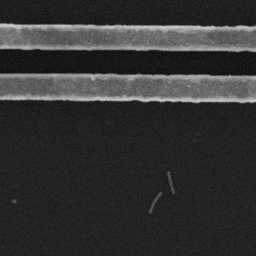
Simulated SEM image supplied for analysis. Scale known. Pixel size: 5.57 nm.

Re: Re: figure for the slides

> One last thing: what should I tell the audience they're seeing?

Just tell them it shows lines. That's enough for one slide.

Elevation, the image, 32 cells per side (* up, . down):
................................
................................
................................
********************************
********************************
********************************
................................
................................
................................
*********************....*......
********************************
********************************
..........**..**.***************
................................
................................
................................
................................
................................
................................
................................
................................
................................
................................
................................
................................
................................
................................
................................
................................
................................
................................
................................